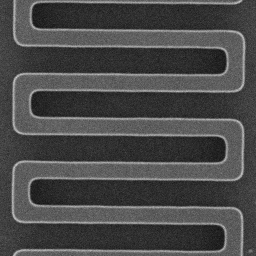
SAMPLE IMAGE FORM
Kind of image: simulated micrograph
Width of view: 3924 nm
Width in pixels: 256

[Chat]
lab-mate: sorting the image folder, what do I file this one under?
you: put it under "groups of lines, slits or small figures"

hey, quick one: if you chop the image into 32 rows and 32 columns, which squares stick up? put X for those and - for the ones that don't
--XXX---------------------------
--XX----------------------------
--XX----------------------------
--XXX---------------------------
--XXXXXXXXXXXXXXXXXXXXXXXXXXXX--
--XXXXXXXXXXXXXXXXXXXXXXXXXXXXX-
----------------------------XXX-
----------------------------XXX-
----------------------------XX--
--XXXXXXXXXXXXXXXXXXXXXXXXXXXX--
--XXXXXXXXXXXXXXXXXXXXXXXXXXXX--
--XX----------------------------
--XX----------------------------
--XX----------------------------
--XX----------------------------
--XXXXXXXXXXXXXXXXXXXXXXXXXXXX--
--XXXXXXXXXXXXXXXXXXXXXXXXXXXX--
----------------------------XX--
----------------------------XX--
----------------------------XX--
--XXXXXXXXXXXXXXXXXXXXXXXXXXXX--
--XXXXXXXXXXXXXXXXXXXXXXXXXXXX--
--XX----------------X---XXXXXX--
--XX----------------------------
--XX----------------------------
--XX----------------------------
--XXXXXXXXXXXXXXXXXXXXXXXXXXXX--
--XXXXXXXXXXXXXXXXXXXXXXXXXXXX--
----------------------------XX--
----------------------------XX--
----------------------------XX--
--XXXXXXXXXXXXXXXXXXXXXXXXXXXX--